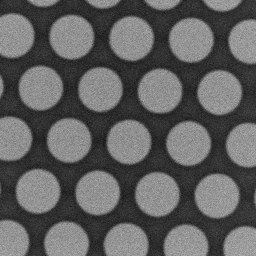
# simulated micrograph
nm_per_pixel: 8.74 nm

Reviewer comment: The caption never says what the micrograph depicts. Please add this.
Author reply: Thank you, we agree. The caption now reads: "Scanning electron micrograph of an array of small figures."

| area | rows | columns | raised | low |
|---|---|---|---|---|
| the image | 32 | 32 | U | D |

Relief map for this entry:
DDDDUUUDDDDUUUDDDDDUUUDDDDUUUUDD
DDDDDDDDDDDDDDDDDDDDDDDDDDDDDDDD
UUUDDDDUUUUDDDDUUUDDDDDUUDDDDDDD
UUUUDDUUUUUDDDUUUUUDDDUUUUDDDUUU
UUUUDDUUUUUUDDUUUUUDDUUUUUUDDUUU
UUUUDDUUUUUUDDUUUUUDDUUUUUUDDUUU
UUUDDDDUUUUDDDUUUUUDDDUUUUDDDUUU
DDDDDDDDDDDDDDDDUDDDDDDUUDDDDDUU
DDDDUUDDDDDDDDDDDDDDDDDDDDDDDDDD
DDDUUUUDDDUUUUUDDDUUUUDDDDUUUDDD
DDUUUUUUDDUUUUUDDUUUUUUDDUUUUUDD
DDUUUUUUDDUUUUUDDUUUUUUDDUUUUUDD
DDDUUUUDDDUUUUUDDDUUUUDDDUUUUUDD
DDDDUUDDDDDUUUDDDDUUUUDDDDUUUDDD
DDDDDDDDDDDDDDDDDDDDDDDDDDDDDDDD
UUUDDDDUUUDDDDDUUUDDDDUUUDDDDDUU
UUUUDDUUUUUDDDUUUUUDDUUUUUDDDUUU
UUUUDDUUUUUDDUUUUUUDDUUUUUDDUUUU
UUUUDDUUUUUDDDUUUUUDDUUUUUDDUUUU
UUUDDDDUUUUDDDUUUUDDDUUUUUDDDUUU
DDDDDDDDDDDDDDDDDDDDDDDUDDDDDDUU
DDDDUUDDDDDUUDDDDDDDDDDDDDDDDDDD
DDUUUUUDDDUUUUDDDDUUUUDDDUUUUDDD
DDUUUUUDDDUUUUUDDUUUUUDDDUUUUUDD
DDUUUUUDDDUUUUUDDUUUUUDDUUUUUUDD
DDDUUUUDDDUUUUUDDUUUUUDDDUUUUUDD
DDDDUUDDDDDUUDDDDDUUUDDDDUUUUDDD
DDDDDDDDDDDDDDDDDDDDDDDDDDDDDDDD
UUUDDDUUUUDDDDUUUDDDDDUUUDDDDDUU
UUUDDDUUUUUDDUUUUUDDDUUUUUDDUUUU
UUUUDDUUUUUDDUUUUUDDDUUUUUDDUUUU
UUUDDDUUUUUDDUUUUUDDDUUUUUDDUUUU